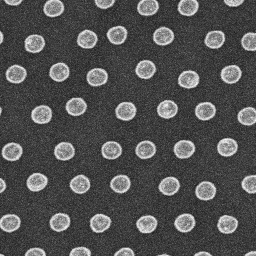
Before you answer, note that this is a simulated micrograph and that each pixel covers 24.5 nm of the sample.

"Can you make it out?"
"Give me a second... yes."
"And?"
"a regular array of raised bodies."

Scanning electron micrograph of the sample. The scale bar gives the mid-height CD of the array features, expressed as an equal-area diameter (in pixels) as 18.5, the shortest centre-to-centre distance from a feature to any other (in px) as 36.5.